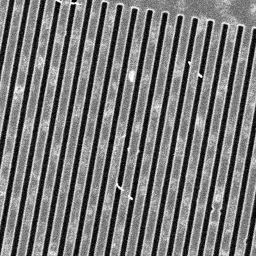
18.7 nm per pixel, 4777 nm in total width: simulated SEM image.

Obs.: parallel lines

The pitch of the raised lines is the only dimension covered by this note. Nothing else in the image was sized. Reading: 286 nm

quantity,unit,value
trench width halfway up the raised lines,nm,112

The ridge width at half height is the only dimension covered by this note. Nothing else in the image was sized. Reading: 9.47 px